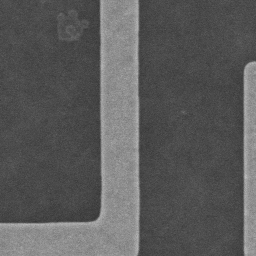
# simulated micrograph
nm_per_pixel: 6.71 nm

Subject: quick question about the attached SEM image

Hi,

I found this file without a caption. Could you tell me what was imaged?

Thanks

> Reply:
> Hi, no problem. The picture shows wiring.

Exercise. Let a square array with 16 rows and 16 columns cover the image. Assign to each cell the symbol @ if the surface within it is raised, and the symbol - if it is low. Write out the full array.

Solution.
------@@@-------
------@@@-------
------@@@-------
------@@@-------
------@@@------@
------@@@------@
------@@@------@
------@@@------@
------@@@------@
------@@@------@
------@@@------@
------@@@------@
------@@@------@
------@@@------@
@@@@@@@@@------@
@@@@@@@@@------@